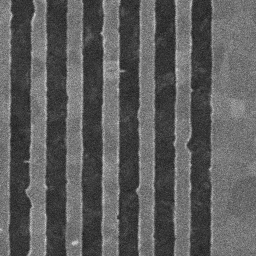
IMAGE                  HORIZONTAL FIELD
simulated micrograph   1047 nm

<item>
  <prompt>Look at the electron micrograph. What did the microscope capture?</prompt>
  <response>parallel lines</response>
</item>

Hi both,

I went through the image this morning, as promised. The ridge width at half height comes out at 59.4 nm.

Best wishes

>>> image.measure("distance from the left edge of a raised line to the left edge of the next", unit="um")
0.148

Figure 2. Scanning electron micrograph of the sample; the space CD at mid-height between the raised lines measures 87 nm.